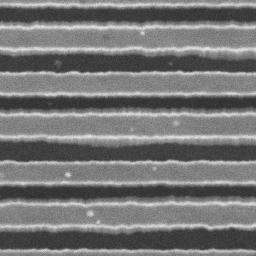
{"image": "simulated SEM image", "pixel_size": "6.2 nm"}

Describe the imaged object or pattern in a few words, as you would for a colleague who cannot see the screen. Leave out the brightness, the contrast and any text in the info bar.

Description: lines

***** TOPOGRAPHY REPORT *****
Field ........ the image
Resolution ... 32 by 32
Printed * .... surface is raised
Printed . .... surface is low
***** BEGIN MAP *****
********************************
................................
................................
********************************
********************************
********************************
.............................**.
................................
................................
********************************
********************************
********************************
................................
................................
********************************
********************************
********************************
................................
................................
................................
********************************
********************************
********************************
................................
................................
********************************
********************************
********************************
..*...**....*****.........*.....
................................
................................
********************************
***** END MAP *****